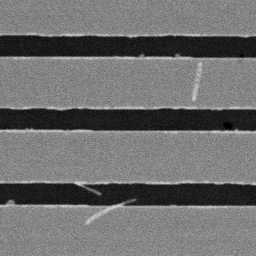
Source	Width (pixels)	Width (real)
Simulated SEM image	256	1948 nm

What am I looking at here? lines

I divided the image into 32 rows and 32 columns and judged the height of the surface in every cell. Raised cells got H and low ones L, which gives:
HHHHHHHHHHHHHHHHHHHHHHHHHHHHHHHH
HHHHHHHHHHHHHHHHHHHHHHHHHHHHHHHH
HHHHHHHHHHHHHHHHHHHHHHHHHHHHHHHH
HHHHHHHHHHHHHHHHHHHHHHHHHHHHHHHH
LLLLLLHLLLLLLLLLHLLLLLLLLLLLLLHL
LLLLLLLLLLLLLLLLLLLLLLLLLLLLLLLL
LLLLLLLLLLLLLLLLLLLLLLLLLLLLLLLL
HHHHHHHHHHHHHHHHHHHHHHHHHHHHHHHH
HHHHHHHHHHHHHHHHHHHHHHHHHHHHHHHH
HHHHHHHHHHHHHHHHHHHHHHHHHHHHHHHH
HHHHHHHHHHHHHHHHHHHHHHHHHHHHHHHH
HHHHHHHHHHHHHHHHHHHHHHHHHHHHHHHH
HHHHHHHHHHHHHHHHHHHHHHHHHHHHHHHH
LHHHLLHHHHHHHHHHHHHHLHHHHHHHHHHH
LLLLLLLLLLLLLLLLLLLLLLLLLLLLLLLL
LLLLLLLLLLLLLLLLLLLLLLLLLLLLLLLL
HHHHHHHHHHHHHHHHHHHHHHHHHHHHHHHH
HHHHHHHHHHHHHHHHHHHHHHHHHHHHHHHH
HHHHHHHHHHHHHHHHHHHHHHHHHHHHHHHH
HHHHHHHHHHHHHHHHHHHHHHHHHHHHHHHH
HHHHHHHHHHHHHHHHHHHHHHHHHHHHHHHH
HHHHHHHHHHHHHHHHHHHHHHHHHHHHHHHH
HHHHHHHHHHHHHHHHHHHHHHHHHHHHHHHH
LLLLLLLLLLLLLLLLLLLLLLLLLLLLLLLL
LLLLLLLLLLLLLLLLLLLLLLLLLLLLLLLL
LLLLLLLLLLLLLLLLLLLLLLLLLLLLLLLL
HHHHHHHHHHHHHHHHHHHHHHHHHHHHHHHH
HHHHHHHHHHHHHHHHHHHHHHHHHHHHHHHH
HHHHHHHHHHHHHHHHHHHHHHHHHHHHHHHH
HHHHHHHHHHHHHHHHHHHHHHHHHHHHHHHH
HHHHHHHHHHHHHHHHHHHHHHHHHHHHHHHH
HHHHHHHHHHHHHHHHHHHHHHHHHHHHHHHH